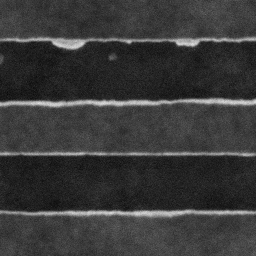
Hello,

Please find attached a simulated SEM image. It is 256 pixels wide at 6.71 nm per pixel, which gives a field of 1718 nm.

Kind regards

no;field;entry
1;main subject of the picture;lines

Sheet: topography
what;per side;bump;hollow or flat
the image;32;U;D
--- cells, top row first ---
UUUUUUUUUUUUUUUUUUUUUUUUUUUUUUUU
UUUUUUUUUUUUUUUUUUUUUUUUUUUUUUUU
UUUUUUUUUUUUUUUUUUUUUUUUUUUUUUUU
UUUUUUUUUUUUUUUUUUUUUUUUUUUUUUUU
UUUUUUUUUUUUUUUUUUUUUUUUUUUUUUUU
DDDDDDDDDDDDDDDDDDDDDDDDDDDDDDDD
DDDDDDDDDDDDDDDDDDDDDDDDDDDDDDDD
DDDDDDDDDDDDDDDDDDDDDDDDDDDDDDDD
DDDDDDDDDDDDDDDDDDDDDDDDDDDDDDDD
DDDDDDDDDDDDDDDDDDDDDDDDDDDDDDDD
DDDDDDDDDDDDDDDDDDDDDDDDDDDDDDDD
DDDDDDDDDDDDDDDDDDDDDDDDDDDDDDDD
DDDDDDDDDDDDDDDDDDDDDDDDUDDDDDDD
UUUUUUUUUUUUUUUUUUUUUUUUUUUUUUUU
UUUUUUUUUUUUUUUUUUUUUUUUUUUUUUUU
UUUUUUUUUUUUUUUUUUUUUUUUUUUUUUUU
UUUUUUUUUUUUUUUUUUUUUUUUUUUUUUUU
UUUUUUUUUUUUUUUUUUUUUUUUUUUUUUUU
UUUUUUUUUUUUUUUUUUUUUUUUUUUUUUUU
DDDDDDDDDDDDDDDDDDDDDDDDDDDDDDDD
DDDDDDDDDDDDDDDDDDDDDDDDDDDDDDDD
DDDDDDDDDDDDDDDDDDDDDDDDDDDDDDDD
DDDDDDDDDDDDDDDDDDDDDDDDDDDDDDDD
DDDDDDDDDDDDDDDDDDDDDDDDDDDDDDDD
DDDDDDDDDDDDDDDDDDDDDDDDDDDDDDDD
DDDDDDDDDDDDDDDDDDDDDDDDDDDDDDDD
UDDDDDDDDDDDUUDDDDDDDDUUUUUUUUDD
UUUUUUUUUUUUUUUUUUUUUUUUUUUUUUUU
UUUUUUUUUUUUUUUUUUUUUUUUUUUUUUUU
UUUUUUUUUUUUUUUUUUUUUUUUUUUUUUUU
UUUUUUUUUUUUUUUUUUUUUUUUUUUUUUUU
UUUUUUUUUUUUUUUUUUUUUUUUUUUUUUUU